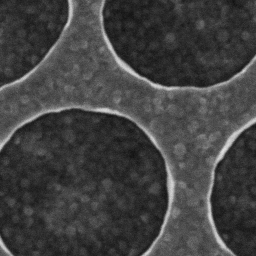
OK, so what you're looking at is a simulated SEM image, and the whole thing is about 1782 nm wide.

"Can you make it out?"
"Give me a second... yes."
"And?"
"holes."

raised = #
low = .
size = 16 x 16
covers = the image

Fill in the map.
....##..........
....##..........
....###.........
...####.........
..######.......#
################
################
##......########
#........######.
..........####..
..........###...
...........##...
...........##...
..........###...
..........####..
.........#####..